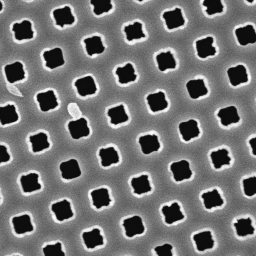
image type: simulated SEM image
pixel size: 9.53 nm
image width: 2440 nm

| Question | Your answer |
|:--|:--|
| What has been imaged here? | a regular array of holes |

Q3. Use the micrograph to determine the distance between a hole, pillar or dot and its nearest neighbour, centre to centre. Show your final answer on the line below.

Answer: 394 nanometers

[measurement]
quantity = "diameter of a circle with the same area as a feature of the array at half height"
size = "0.187 um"